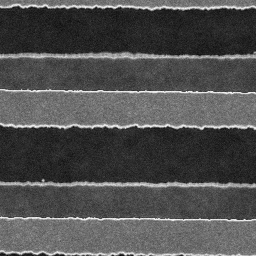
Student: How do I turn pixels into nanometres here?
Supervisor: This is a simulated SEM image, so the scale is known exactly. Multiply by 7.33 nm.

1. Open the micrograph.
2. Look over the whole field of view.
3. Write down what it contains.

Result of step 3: lines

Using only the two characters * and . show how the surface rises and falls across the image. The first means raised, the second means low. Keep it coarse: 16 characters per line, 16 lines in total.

.........*.**...
................
................
.....*..........
****************
****************
****************
****************
................
................
................
**..............
****************
****************
****************
****************